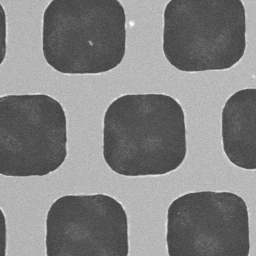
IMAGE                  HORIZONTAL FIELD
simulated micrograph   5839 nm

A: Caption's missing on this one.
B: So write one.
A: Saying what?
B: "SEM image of holes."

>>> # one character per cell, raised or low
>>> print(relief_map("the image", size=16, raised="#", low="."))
###.....##.....#
###.....##.....#
###.....##.....#
###.....##.....#
####..##########
################
....###....###..
....###.....##..
....##......##..
....##......##..
....###....####.
################
####...####....#
###.....##.....#
###.....##......
###.....##......